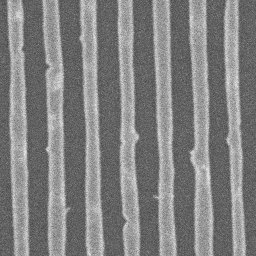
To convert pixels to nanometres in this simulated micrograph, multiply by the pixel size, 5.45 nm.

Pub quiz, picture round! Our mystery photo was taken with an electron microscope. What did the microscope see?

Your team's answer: parallel lines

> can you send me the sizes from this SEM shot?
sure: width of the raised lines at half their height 81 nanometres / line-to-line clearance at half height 117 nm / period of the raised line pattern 196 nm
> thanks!